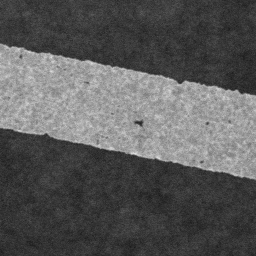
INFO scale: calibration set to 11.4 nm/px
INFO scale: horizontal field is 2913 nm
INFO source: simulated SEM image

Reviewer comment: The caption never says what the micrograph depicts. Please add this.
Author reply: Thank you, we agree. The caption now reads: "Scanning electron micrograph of one or a few lines or trenches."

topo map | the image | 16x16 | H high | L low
LLLLLLLLLLLLLLLL
LLLLLLLLLLLLLLLL
LLLLLLLLLLLLLLLL
HHHHLLLLLLLLLLLL
HHHHHHHHHLLLLLLL
HHHHHHHHHHHHHHLL
HHHHHHHHHHHHHHHH
HHHHHHHHHHHHHHHH
LLLHHHHHHHHHHHHH
LLLLLLLLHHHHHHHH
LLLLLLLLLLLLLHHH
LLLLLLLLLLLLLLLL
LLLLLLLLLLLLLLLL
LLLLLLLLLLLLLLLL
LLLLLLLLLLLLLLLL
LLLLLLLLLLLLLLLL